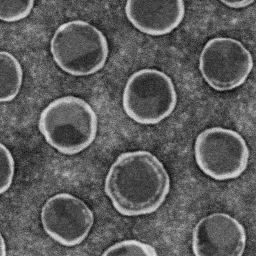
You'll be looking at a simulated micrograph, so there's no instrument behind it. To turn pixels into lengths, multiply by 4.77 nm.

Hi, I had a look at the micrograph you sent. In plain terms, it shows raised bodies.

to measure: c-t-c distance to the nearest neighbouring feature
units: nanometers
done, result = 376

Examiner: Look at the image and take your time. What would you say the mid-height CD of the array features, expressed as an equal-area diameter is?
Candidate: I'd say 241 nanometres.